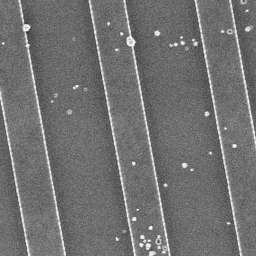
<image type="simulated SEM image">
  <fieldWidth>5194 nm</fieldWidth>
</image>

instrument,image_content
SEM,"lines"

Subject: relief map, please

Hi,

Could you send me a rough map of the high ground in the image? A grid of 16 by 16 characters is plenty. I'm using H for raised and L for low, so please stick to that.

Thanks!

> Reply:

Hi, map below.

HLLLLLHHLLLLHHHL
HHLLLLHHLLLLHHHL
HHLLLLHHLLLLLHHL
HHLLLLHHLLLLLHHL
HHLLLLHHHLLLLHHL
HHLLLLLHHLLLLHHL
HHLLLLLHHLLLLHHH
HHHLLLLHHLLLLLHH
HHHLLLLHHLLLLLHH
LHHLLLLHHLLLLLHH
LHHLLLLHHHLLLLHH
LHHLLLLLHHLLLLHH
LHHLLLLLHHLLLLHH
LHHHLLLLHHLLLLLH
LLHHLLLLHHLLLLLH
LLHHLLLLHHHLLLLH